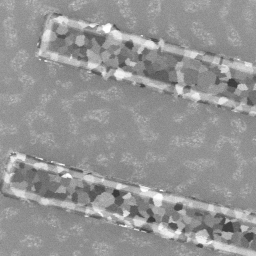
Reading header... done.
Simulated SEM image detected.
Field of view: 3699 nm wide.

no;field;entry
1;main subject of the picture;one or a few lines or trenches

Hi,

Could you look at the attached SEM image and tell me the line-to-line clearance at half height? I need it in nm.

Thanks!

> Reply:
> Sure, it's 1560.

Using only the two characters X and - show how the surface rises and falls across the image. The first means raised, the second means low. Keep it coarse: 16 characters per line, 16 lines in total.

----------------
---XX-----------
---XXXXXX-------
---XXXXXXXXX----
-------XXXXXXXXX
-----------XXXXX
--------------XX
----------------
----------------
----------------
-XX-------------
XXXXXXX---------
---XXXXXXXX-----
-------XXXXXXXX-
----------XXXXXX
--------------XX